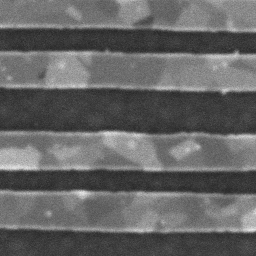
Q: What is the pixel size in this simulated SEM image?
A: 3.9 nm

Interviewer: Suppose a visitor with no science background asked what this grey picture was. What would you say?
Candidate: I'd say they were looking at lines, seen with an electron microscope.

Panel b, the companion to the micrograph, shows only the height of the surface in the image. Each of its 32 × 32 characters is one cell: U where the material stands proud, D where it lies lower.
UUUUUUUUUUUUUUUUUUUUUUUUUUUUUUUU
UUUUUUUUUUUUUUUUUUUUUUUUUUUUUUUU
UUUUUUUUUUUUUUUUUUUUUUUUUUUUUUUU
DDDDDDDDDDDDDDDUUUUUUUUUUUUUUUUU
DDDDDDDDDDDDDDDDDDDDDDDDDDDDDDDD
DDDDDDDDDDDDDDDDDDDDDDDDDDDDDDDD
DDDDDDDDDDDDDDDDDDDDDDDDDDDDDDDD
UUUUUUUUUUUUUUUUUUUUUUUUUUUUUUUU
UUUUUUUUUUUUUUUUUUUUUUUUUUUUUUUU
UUUUUUUUUUUUUUUUUUUUUUUUUUUUUUUU
UUUUUUUUUUUUUUUUUUUUUUUUUUUUUUUU
DDDDDDDDDDDDDDDDDDDDDDDDDDDDDDDD
DDDDDDDDDDDDDDDDDDDDDDDDDDDDDDDD
DDDDDDDDDDDDDDDDDDDDDDDDDDDDDDDD
DDDDDDDDDDDDDDDDDDDDDDDDDDDDDDDD
DDDDDDDDDDDDDDDDDDDDDDDDDDDDDDDD
DDDDDDDDDDDDDDDDDDDDDDDDDDDDDDDD
UUUUUUUUUUUUUUUUUUUUUUUUUUUUUUUU
UUUUUUUUUUUUUUUUUUUUUUUUUUUUUUUU
UUUUUUUUUUUUUUUUUUUUUUUUUUUUUUUU
UUUUUUUUUUUUUUUUUUUUUUUUUUUUUUUU
DDDDDDDDDDDDDDDDDDDDDDDDDDDDDDDD
DDDDDDDDDDDDDDDDDDDDDDDDDDDDDDDD
DDDDDDDDDDDDDDDDDDDDDDDDDDDDDDDD
UUUUUUUUUUUUUUUUUUUUUUUUUUUUUUUU
UUUUUUUUUUUUUUUUUUUUUUUUUUUUUUUU
UUUUUUUUUUUUUUUUUUUUUUUUUUUUUUUU
UUUUUUUUUUUUUUUUUUUUUUUUUUUUUUUU
DUDDUUUUUUUUUUUUUUUUUUUUUUUUUUUU
DDDDDDDDDDDDDDDDDDDDDDDDDDDDDDDD
DDDDDDDDDDDDDDDDDDDDDDDDDDDDDDDD
DDDDDDDDDDDDDDDDDDDDDDDDDDDDDDDD